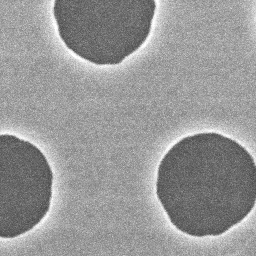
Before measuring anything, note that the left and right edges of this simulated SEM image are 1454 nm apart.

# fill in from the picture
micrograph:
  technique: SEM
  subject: holes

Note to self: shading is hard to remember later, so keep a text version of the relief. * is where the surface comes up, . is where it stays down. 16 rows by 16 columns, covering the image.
***.......******
***.......******
****.....*******
*****...********
****************
****************
****************
****************
.***********..**
...*******......
...*******......
...*******......
...*******......
...*******.....*
..*********...**
****************